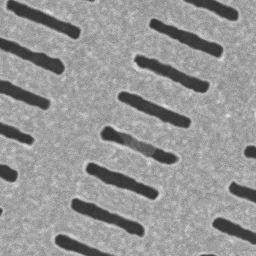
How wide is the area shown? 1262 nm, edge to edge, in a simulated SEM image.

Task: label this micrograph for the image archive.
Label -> holes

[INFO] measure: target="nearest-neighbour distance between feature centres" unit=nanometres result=191